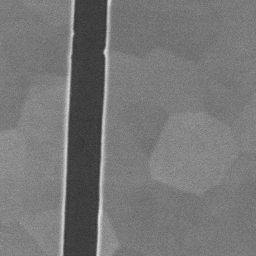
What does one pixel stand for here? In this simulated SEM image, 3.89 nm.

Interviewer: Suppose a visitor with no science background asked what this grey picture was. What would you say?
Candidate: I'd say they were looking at one or a few lines or trenches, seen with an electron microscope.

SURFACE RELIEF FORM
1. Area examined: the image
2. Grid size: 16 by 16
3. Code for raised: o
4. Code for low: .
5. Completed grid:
ooooo..ooooooooo
ooooo..ooooooooo
ooooo..ooooooooo
oooo...ooooooooo
oooo...ooooooooo
oooo...ooooooooo
oooo..oooooooooo
oooo..oooooooooo
oooo..oooooooo.o
oooo..oooooooooo
oooo..oooooooooo
oooo..oooooooooo
oooo..oooooooooo
oooo..oooooooooo
oooo..oooooooooo
oooo..oooooooooo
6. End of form